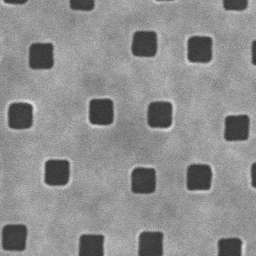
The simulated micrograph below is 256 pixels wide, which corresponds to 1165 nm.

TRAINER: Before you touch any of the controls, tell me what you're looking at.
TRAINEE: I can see a regular array of holes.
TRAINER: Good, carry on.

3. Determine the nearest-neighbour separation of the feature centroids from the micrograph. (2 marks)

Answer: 268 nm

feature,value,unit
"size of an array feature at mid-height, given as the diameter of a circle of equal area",128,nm